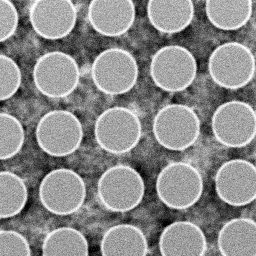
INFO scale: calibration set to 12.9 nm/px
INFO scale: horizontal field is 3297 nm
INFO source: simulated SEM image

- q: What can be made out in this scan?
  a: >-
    an array of small figures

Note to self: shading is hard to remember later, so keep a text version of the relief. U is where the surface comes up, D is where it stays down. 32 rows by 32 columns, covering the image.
UDDDUUUUUDDUUUUUUDDUUUUUDDUUUUUD
UUDDUUUUUDDUUUUUUDDUUUUUDDUUUUUD
UUDDUUUUUDDUUUUUUDDUUUUUDDUUUUUD
UUDDUUUUUDDDUUUUDDDDUUUDDDDDUDDD
UDDDDUUUDDDDDDDDDDDDDDDDDDDDDDDD
DDDDDDDDDDDDDDDDDDDDDDDDDDDDUUDD
DDDDDDDDDDDDDUUUDDDDUUUUDDDUUUUD
UDDDDUUUUDDDUUUUUDDUUUUUDDUUUUUU
UUDDUUUUUUDDUUUUUDDUUUUUDDUUUUUU
UUDDUUUUUUDDUUUUUDDUUUUUDDDUUUUD
UUDDUUUUUUDDUUUUUDDDUUUUDDDUUUUD
UUDDDUUUUDDDDUUDDDDDDDDDDDDDDDDD
DDDDDDDDDDDDDDDDDDDDDDDDDDDDDDDD
DDDDDDDDDDDDDDUDDDDDDUUDDDDUUUUD
UDDDDDUUUDDDDUUUUDDDUUUUDDDUUUUU
UUDDDUUUUUDDUUUUUDDUUUUUUDDUUUUU
UUUDDUUUUUDDUUUUUUDUUUUUUDDUUUUU
UUUDDUUUUUDDUUUUUDDDUUUUDDDUUUUD
UUUDDUUUUUDDDUUUDDDDDUUDDDDDDDDD
UDDDDDDDDDDDDDDDDDDDDDDDDDDDDDDD
DDDDDDDDDDDDDDDDDDDDDDUDDDDDUUUD
DDDDDDDUUDDDDUUUUDDDUUUUUDDUUUUU
UUUDDUUUUUDDDUUUUUDDUUUUUDDUUUUU
UUUDDUUUUUUDUUUUUUDDUUUUUDDUUUUU
UUUDDUUUUUUDUUUUUUDDUUUUUDDUUUUU
UUUDDUUUUUDDDUUUUDDDDUUUDDDDDUDD
UUDDDDDUUDDDDDDDDDDDDDDDDDDDDDDD
DDDDDDDDDDDDDDDDDDDDDDDDDDDDDUUD
DDDDDDDDDDDDDDUUUDDDDUUUUDDDUUUU
UUUDDDUUUUDDDUUUUUDDUUUUUDDUUUUU
UUUDDUUUUUUDDUUUUUDDUUUUUUDUUUUU
UUUUDUUUUUUDDUUUUUDDUUUUUDDDUUUU